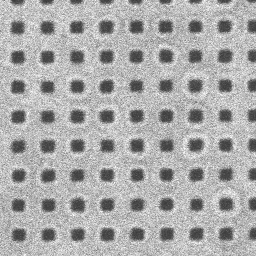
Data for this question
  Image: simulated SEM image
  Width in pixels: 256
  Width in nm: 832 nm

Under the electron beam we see a regular array of holes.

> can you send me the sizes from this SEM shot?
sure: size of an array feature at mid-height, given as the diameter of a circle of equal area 42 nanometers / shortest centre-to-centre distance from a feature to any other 0.0952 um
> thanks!